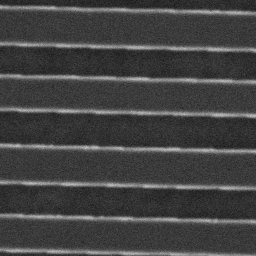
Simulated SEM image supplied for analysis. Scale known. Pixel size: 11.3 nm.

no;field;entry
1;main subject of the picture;lines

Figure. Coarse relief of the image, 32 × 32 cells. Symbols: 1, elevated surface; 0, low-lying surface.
00000000000000000000000000000000
11111111111111111111111111111100
11111111111111111111111111111111
11111111111111111111111111111111
11111111111111111111111111111111
11111111111111111111111111111111
00000000000000000000000000000000
00000000000000000000000000000000
00000000000000000000000000000000
11100000000000000000000000000000
11111111111111111111111111111111
11111111111111111111111111111111
11111111111111111111111111111111
11111111111111111111111111111111
00000000000000000000000000000000
00000000000000000000000000000000
00000000000000000000000000000000
00000000000000000000000000000000
11111111111111100000000000000000
11111111111111111111111111111111
11111111111111111111111111111111
11111111111111111111111111111111
11111111111111111111111111111111
00000000000000000000000000000111
00000000000000000000000000000000
00000000000000000000000000000000
00000000000000000000000000000000
11111111111111111111111111000000
11111111111111111111111111111111
11111111111111111111111111111111
11111111111111111111111111111111
00000001111111111111111111111111